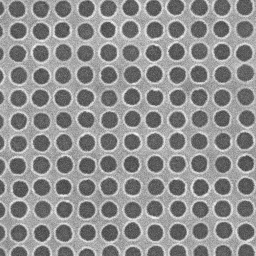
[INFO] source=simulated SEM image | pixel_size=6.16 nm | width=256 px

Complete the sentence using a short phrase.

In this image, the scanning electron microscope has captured a regular array of holes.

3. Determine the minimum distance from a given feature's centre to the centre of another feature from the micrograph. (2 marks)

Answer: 135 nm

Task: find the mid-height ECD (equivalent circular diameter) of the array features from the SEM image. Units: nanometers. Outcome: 106